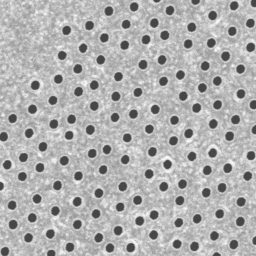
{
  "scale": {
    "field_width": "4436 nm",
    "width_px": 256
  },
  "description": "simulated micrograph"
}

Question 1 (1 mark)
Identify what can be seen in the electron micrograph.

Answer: a regular array of holes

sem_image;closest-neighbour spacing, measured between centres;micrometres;0.339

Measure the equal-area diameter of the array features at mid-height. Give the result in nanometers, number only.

164